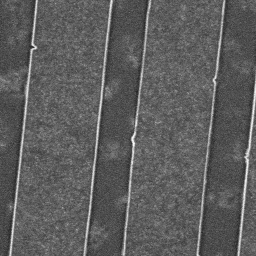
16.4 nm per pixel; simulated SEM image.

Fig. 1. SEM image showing one or a few lines or trenches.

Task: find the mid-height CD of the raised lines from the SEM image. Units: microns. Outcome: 1.21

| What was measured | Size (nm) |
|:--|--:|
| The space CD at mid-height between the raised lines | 627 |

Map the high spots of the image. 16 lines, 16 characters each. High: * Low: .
..*****..*****..
..*****..*****..
..*****..*****..
..*****..*****..
..****...*****..
..****...****...
..****...****...
..****...****...
.*****..*****...
.*****..*****...
.*****..*****..*
.*****..*****..*
.*****..*****..*
.*****..*****..*
.****...****...*
.****...****...*